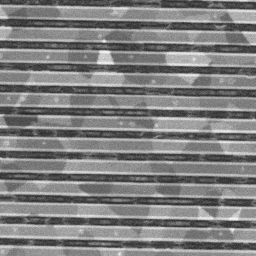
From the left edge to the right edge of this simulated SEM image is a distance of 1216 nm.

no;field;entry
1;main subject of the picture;parallel lines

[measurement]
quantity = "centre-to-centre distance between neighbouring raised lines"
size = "104 nm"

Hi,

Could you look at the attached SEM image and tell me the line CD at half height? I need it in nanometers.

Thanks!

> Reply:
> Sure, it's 60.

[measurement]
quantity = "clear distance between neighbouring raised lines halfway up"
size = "46.3 nm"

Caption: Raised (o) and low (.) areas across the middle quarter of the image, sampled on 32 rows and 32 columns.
................................
................................
oooooooooooo....................
oooooooooooooooooooooooooooooooo
oooooooooooooooooooooooooooooooo
...........................ooooo
................................
................................
oooooooooooooooooooooooooooooooo
oooooooooooooooooooooooooooooooo
oooooooooooooooooooooooooooooooo
................................
................................
oooooooooooooo..................
oooooooooooooooooooooooooooooooo
oooooooooooooooooooooooooooooooo
..................oooooooooooooo
................................
................................
oooooooooooooooooooooooooooooooo
oooooooooooooooooooooooooooooooo
oooooooooooooooooooooooooooooooo
................................
................................
oooooooooooooooo................
oooooooooooooooooooooooooooooooo
oooooooooooooooooooooooooooooooo
....................oooo........
................................
................................
oooooooooooooooooooooooooooooooo
oooooooooooooooooooooooooooooooo